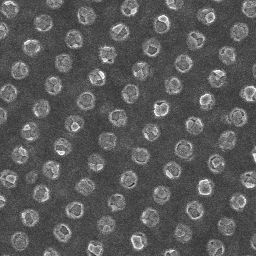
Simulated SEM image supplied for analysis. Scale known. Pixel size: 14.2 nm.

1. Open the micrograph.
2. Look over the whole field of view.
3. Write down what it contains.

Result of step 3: a regular array of raised bodies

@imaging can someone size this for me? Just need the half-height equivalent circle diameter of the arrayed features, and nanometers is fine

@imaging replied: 220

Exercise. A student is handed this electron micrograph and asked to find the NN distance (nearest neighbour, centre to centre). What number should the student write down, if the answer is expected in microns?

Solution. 0.362